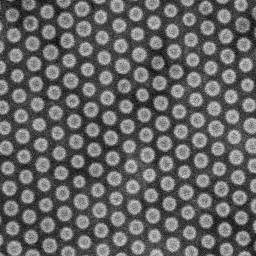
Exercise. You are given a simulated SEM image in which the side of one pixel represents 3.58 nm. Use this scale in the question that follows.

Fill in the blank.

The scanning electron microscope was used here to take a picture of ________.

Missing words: a regular array of raised bodies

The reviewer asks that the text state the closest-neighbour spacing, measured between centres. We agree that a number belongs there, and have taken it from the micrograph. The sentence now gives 20 px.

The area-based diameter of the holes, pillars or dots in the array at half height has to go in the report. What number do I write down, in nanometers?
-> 46.9